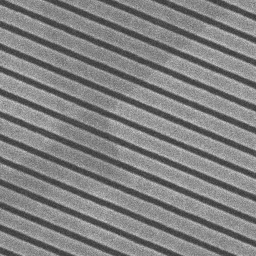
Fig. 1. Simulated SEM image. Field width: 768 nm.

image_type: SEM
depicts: parallel lines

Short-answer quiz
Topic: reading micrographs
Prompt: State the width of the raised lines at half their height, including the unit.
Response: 42.9 nm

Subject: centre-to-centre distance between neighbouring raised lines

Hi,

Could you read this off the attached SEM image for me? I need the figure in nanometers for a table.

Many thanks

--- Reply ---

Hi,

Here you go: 62.6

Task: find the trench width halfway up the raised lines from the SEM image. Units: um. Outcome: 0.0204